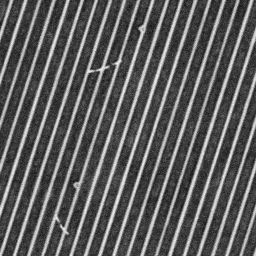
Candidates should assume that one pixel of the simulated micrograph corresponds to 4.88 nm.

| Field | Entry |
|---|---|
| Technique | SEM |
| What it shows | parallel lines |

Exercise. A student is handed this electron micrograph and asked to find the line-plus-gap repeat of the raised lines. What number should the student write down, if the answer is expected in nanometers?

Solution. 65.8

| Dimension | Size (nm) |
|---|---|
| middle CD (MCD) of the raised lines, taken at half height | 12.2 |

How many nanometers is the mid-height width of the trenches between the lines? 54.1